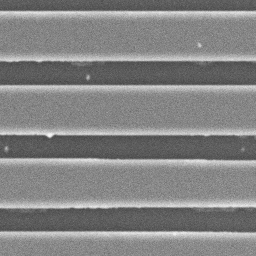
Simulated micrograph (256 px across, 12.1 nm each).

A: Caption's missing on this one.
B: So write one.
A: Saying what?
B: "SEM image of lines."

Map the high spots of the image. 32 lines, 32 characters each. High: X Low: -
--------------------------------
XXXXXXXXXXXXXXXXXXXXXXXXXXXXXXXX
XXXXXXXXXXXXXXXXXXXXXXXXXXXXXXXX
XXXXXXXXXXXXXXXXXXXXXXXXXXXXXXXX
XXXXXXXXXXXXXXXXXXXXXXXXXXXXXXXX
XXXXXXXXXXXXXXXXXXXXXXXXXXXXXXXX
XXXXXXXXXXXXXXXXXXXXXXXXXXXXXXXX
XXXXXXXXXXXXXXXXXXXXXXXXXXXXXXXX
--------------------------------
--------------------------------
--------------------------------
XXXXXXXXXXXXXXXXXXXXXXXXXXXXXXXX
XXXXXXXXXXXXXXXXXXXXXXXXXXXXXXXX
XXXXXXXXXXXXXXXXXXXXXXXXXXXXXXXX
XXXXXXXXXXXXXXXXXXXXXXXXXXXXXXXX
XXXXXXXXXXXXXXXXXXXXXXXXXXXXXXXX
XXXXXXXXXXXXXXXXXXXXXXXXXXXXXXXX
--------------------------------
--------------------------------
--------------------------------
XXXXXXXXXXXXXXXXXXXXXXXXXXXXXXXX
XXXXXXXXXXXXXXXXXXXXXXXXXXXXXXXX
XXXXXXXXXXXXXXXXXXXXXXXXXXXXXXXX
XXXXXXXXXXXXXXXXXXXXXXXXXXXXXXXX
XXXXXXXXXXXXXXXXXXXXXXXXXXXXXXXX
XXXXXXXXXXXXXXXXXXXXXXXXXXXXXXXX
--------------------------------
--------------------------------
--------------------------------
XXXXXXXXXXXXXXXXXXXXXXXXXXXXXXXX
XXXXXXXXXXXXXXXXXXXXXXXXXXXXXXXX
XXXXXXXXXXXXXXXXXXXXXXXXXXXXXXXX